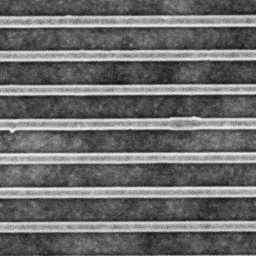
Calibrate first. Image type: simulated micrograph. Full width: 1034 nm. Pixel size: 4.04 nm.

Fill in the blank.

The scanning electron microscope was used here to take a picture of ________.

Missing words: parallel lines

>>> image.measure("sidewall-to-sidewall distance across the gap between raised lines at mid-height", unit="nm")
101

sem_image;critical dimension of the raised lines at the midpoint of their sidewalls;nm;36.4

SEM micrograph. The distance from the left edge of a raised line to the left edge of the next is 138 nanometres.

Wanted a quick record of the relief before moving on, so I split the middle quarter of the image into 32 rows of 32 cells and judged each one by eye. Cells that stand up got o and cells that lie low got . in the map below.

................................
................................
................................
................................
................................
oooooooo.ooooo.ooooooooooooooooo
oooooooooooooooooooooooooooooooo
..oooo..........................
................................
................................
................................
................................
................................
................................
oooooooooooooooooooooooooooooooo
oooooooooooooooooooooooooooooooo
................................
................................
................................
................................
................................
................................
................................
oooooooooooooooooooooooooooooooo
oooooooooooooooooooooooooooooooo
................................
................................
................................
................................
................................
................................
oooooooooooooooooooooooooooooooo